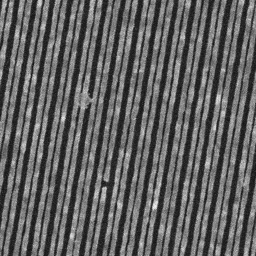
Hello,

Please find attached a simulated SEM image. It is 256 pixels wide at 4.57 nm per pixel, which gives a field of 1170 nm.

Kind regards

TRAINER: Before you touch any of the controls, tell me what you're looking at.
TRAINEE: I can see parallel lines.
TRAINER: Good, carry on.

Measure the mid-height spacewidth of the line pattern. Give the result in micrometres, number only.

0.0259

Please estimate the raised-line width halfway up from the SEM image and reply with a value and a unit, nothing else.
22.6 nm